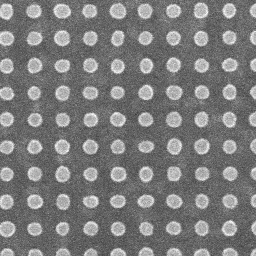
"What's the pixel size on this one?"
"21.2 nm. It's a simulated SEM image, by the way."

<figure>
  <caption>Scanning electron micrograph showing a regular array of raised bodies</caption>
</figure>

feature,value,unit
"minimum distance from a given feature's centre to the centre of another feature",571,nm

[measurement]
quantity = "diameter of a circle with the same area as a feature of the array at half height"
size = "280 nanometers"